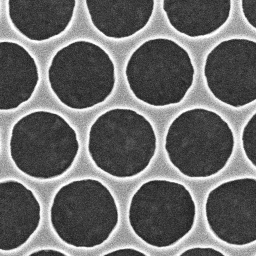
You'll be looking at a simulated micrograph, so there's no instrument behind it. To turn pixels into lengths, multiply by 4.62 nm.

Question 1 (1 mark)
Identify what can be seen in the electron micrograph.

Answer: holes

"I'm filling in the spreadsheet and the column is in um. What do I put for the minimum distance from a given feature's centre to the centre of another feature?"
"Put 0.359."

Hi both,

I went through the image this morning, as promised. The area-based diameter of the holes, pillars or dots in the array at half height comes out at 312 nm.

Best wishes